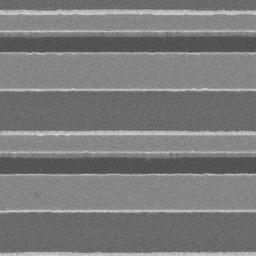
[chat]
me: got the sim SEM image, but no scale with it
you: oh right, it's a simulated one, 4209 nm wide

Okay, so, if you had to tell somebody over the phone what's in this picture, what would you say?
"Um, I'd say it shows lines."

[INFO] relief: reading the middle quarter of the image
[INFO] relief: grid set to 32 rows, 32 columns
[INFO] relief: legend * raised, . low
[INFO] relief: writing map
********************************
********************************
********************************
********************************
********************************
********************************
*.........................***...
................................
................................
................................
................................
................................
................................
................................
................................
................................
................................
********************************
********************************
********************************
********************************
********************************
................................
................................
................................
................................
................................
................................
********************************
********************************
********************************
********************************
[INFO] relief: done